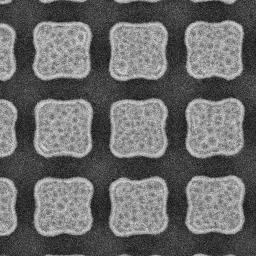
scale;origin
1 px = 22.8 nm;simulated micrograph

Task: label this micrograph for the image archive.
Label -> a regular array of raised bodies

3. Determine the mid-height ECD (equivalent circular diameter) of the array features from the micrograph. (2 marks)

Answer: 59.9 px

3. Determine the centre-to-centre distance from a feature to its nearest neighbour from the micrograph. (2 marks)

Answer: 1740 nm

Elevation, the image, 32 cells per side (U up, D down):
DDDDDDDDDDDDDDDDDDDDDDDDDDDDDDDD
DDDDDDDDDDDDDDDDDDDDDDDDDDDDDDDD
DDDDDDDDDDDDDDDDDDDDDDDDDDDDDDDD
UDDDDUUUUUUDDDUUUUUUDDDDUUUUUUDD
UUDDUUUUUUUDDDUUUUUUUDDUUUUUUUDD
UUDDUUUUUUUDDDUUUUUUUDDUUUUUUUDD
UUDDDUUUUUUDDDUUUUUUDDDDUUUUUUDD
UUDDUUUUUUUDDDUUUUUUUDDDUUUUUUDD
UUDDUUUUUUUDDDUUUUUUUDDDUUUUUUDD
UDDDDUUUDUDDDDUUUUUUDDDDUUDUUDDD
DDDDDDDDDDDDDDDDDDDDDDDDDDDDDDDD
DDDDDDDDDDDDDDDDDDDDDDDDDDDDDDDD
DDDDDDDDDDDDDDDDDDDDDDDDDDDDUDDD
UUDDDUUUUUUDDDUUUUUUUDDDUUUUUUDD
UUDDDUUUUUUDDDUUUUUUUDDUUUUUUUDD
UUDDDUUUUUUDDDUUUUUUDDDDUUUUUUDD
UUDDDUUUUUUDDDUUUUUUDDDDUUUUUUDD
UUDDUUUUUUUDDDUUUUUUUDDUUUUUUUDD
UUDDDUUUUUUDDDUUUUUUUDDDUUUUUUDD
DDDDDDDDDDDDDDDDDDDDDDDDDUDDDDDD
DDDDDDDDDDDDDDDDDDDDDDDDDDDDDDDD
DDDDDDDDDDDDDDDDDDDDDDDDDDDDDDDD
UDDDDDUDDUDDDDDUDDUUDDDDUUUUUUDD
UUDDDUUUUUUDDDUUUUUUUDDUUUUUUUDD
UUDDDUUUUUUDDDUUUUUUUDDUUUUUUUDD
UUDDDUUUUUUDDDUUUUUUUDDDUUUUUUDD
UUDDDUUUUUUDDDUUUUUUUDDDUUUUUUDD
UUDDUUUUUUUDDDUUUUUUUDDUUUUUUUDD
UUDDDUUUUUUDDDUUUUUUDDDDUUUUUUDD
DDDDDDDDDDDDDDDDDDDDDDDDDDDDDDDD
DDDDDDDDDDDDDDDDDDDDDDDDDDDDDDDD
DDDDDDDDDDDDDDDDDDDDDDDDDDDDDDDD